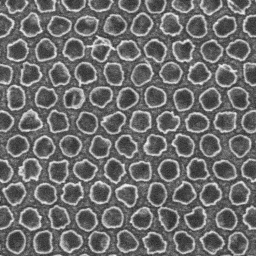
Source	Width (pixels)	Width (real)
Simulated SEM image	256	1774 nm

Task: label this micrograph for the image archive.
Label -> a regular array of raised bodies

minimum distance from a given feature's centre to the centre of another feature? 0.184 um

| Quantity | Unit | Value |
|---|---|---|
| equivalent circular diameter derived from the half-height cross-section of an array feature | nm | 148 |